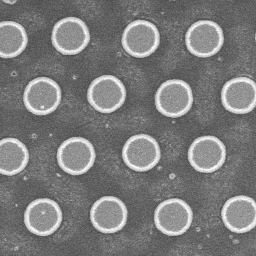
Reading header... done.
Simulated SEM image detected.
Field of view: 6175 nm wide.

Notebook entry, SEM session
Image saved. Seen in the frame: a regular array of raised bodies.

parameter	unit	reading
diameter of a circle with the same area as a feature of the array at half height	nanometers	839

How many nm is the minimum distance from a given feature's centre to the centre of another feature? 1560